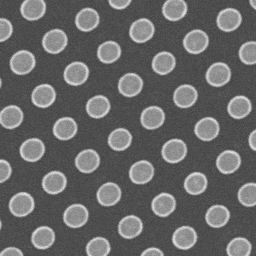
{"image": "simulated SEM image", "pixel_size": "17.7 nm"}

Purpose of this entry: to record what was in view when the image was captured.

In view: a regular array of raised bodies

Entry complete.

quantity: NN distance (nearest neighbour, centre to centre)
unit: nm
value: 692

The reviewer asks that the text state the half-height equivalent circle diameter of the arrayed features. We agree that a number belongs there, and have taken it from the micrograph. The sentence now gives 392 nanometres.